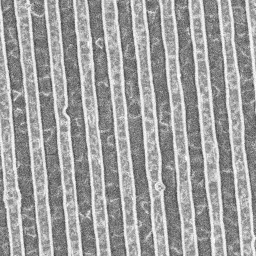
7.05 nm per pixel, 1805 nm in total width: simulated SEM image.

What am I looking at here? parallel lines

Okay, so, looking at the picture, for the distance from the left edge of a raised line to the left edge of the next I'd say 0.203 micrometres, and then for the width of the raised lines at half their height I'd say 82.5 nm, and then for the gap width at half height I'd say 118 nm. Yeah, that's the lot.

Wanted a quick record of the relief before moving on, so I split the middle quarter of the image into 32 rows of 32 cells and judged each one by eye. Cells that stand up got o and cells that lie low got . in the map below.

....ooo....ooo.....oo.....oo....
....ooo.....oo.....oo.....oo....
....ooo....ooo.....ooo....ooo...
.....oo.....oo.....ooo....ooo...
.....oo.....ooo....ooo....ooo...
.....oo.....ooo....ooo....ooo...
.....ooo....ooo....ooo....ooo...
.....ooo....ooo....ooo.....oo...
.....ooo....ooo.....oo.....ooo..
o....ooo....ooo.....oo.....ooo..
o....ooo.....oo.....ooo....ooo..
.....ooo.....oo.....ooo....ooo..
.....ooo.....oo.....ooo....ooo..
o.....oo.....oo.....ooo....ooo..
o.....oo.....ooo....ooo....ooo..
o.....oo.....ooo....ooo....ooo..
o.....oo.....ooo....ooo.....oo..
o.....oo.....ooo....ooo.....oo..
o.....ooo....ooo....ooo.....oo..
o.....ooo....ooo....ooo.....ooo.
oo....ooo....ooo.....oo.....ooo.
oo....ooo....ooo.....ooo....ooo.
oo....ooo.....oo.....ooo....ooo.
oo....ooo.....oo.....ooo....ooo.
oo.....oo.....oo.....ooo....ooo.
oo.....oo.....ooo....ooo....ooo.
oo.....ooo....ooo....ooo....ooo.
oo.....ooo....ooo....ooo.....oo.
oo.....ooo....ooo....ooo....ooo.
oo.....ooo....ooo....ooo.....oo.
ooo....ooo....ooo.....ooo....oo.
ooo....ooo....ooo.....ooo....ooo